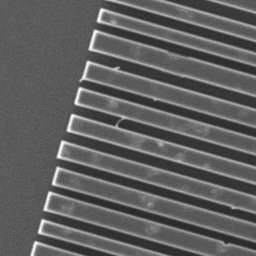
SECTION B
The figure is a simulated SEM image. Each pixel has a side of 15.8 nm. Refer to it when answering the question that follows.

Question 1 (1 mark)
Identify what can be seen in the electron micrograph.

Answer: parallel lines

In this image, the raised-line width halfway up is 275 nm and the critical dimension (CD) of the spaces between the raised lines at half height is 152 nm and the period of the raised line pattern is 0.428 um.